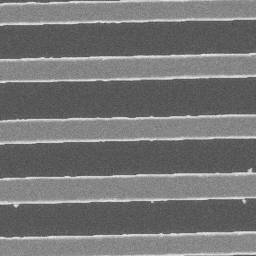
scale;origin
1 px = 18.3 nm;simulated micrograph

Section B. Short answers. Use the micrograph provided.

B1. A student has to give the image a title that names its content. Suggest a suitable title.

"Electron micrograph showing lines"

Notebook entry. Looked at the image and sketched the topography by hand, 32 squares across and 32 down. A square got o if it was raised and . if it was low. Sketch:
oooooooooooooooooooooooooooooooo
oooooooooooooooooooooooooooooooo
ooooooooooooooooooooooo.........
................................
................................
................................
................................
oooooooooooooooooooooooooooooooo
oooooooooooooooooooooooooooooooo
oooooooooooooooooooooooooooooooo
................................
................................
................................
................................
........................oooooooo
oooooooooooooooooooooooooooooooo
oooooooooooooooooooooooooooooooo
ooooooooooooooooo...............
................................
................................
................................
................................
oooooooooooooooooooooooooooooooo
oooooooooooooooooooooooooooooooo
oooooooooooooooooooooooooooooooo
................................
................................
................................
................................
............oooooooooooooooooooo
oooooooooooooooooooooooooooooooo
oooooooooooooooooooooooooooooooo